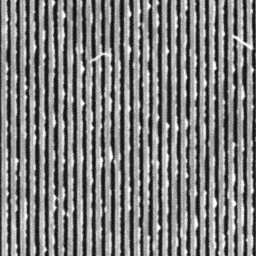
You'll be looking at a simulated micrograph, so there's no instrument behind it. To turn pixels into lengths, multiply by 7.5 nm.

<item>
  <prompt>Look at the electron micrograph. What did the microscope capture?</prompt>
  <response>parallel lines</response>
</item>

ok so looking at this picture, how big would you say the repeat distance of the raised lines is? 70.8 nanometers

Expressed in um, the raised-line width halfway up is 0.0385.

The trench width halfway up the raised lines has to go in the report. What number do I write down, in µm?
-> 0.0319